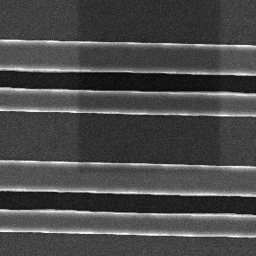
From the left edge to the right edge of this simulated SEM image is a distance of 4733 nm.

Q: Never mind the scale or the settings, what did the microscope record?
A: lines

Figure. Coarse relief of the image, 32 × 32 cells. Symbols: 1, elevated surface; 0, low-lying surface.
00000000000000000000000000000000
00000000000000000000000000000000
00000000000000000000000000000000
00000000000000000000000000000000
00000000000000000000000000000000
11111111111111111111100000000000
11111111111111111111111111111111
11111111111111111111111111111111
11111111111111111111111111111111
00000000000000000000000000000000
00000000000000000000000000000000
11111111111111100000000000000000
11111111111111111111111111111111
11111111111111111111111111111111
00000000000000000000000000000000
00000000000000000000000000000000
00000000000000000000000000000000
00000000000000000000000000000000
00000000000000000000000000000000
00000000000000000000000000000000
11111111111111111000000000000000
11111111111111111111111111111111
11111111111111111111111111111111
11111111111111111111111111111111
00000000000000000000000000000000
00000000000000000000000000000000
11111111110000000000000000000000
11111111111111111111111111111111
11111111111111111111111111111111
00000000000000000000000000000111
00000000000000000000000000000000
00000000000000000000000000000000